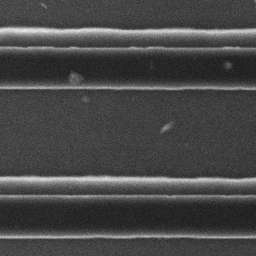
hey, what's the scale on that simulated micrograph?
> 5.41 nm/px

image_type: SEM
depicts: lines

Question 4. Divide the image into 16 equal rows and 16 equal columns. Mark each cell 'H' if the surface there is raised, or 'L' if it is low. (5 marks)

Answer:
LLLLLLLLLLLLLLLL
LLLLLLLLLLLLLLLL
HHHHHHHHHHHHHHHH
HHHHHHHHHHHHHHHH
HHHHHHHHHHHHHHHH
HLLHHHHHHHHHHHHH
LLLLLLLLLLLLLLLL
LLLLLLLLLLLLLLLL
LLLLLLLLLLLLLLLL
LLLLLLLLLLLLLLLL
LLLLLLLLLLLLLLLL
HHHHHHHHHHHHHHHH
HHHHHHHHHHHHHHHH
HHHHHHHHHHHHHHHH
HHHHHHHHHHHHHHHH
LLLLLLLLLLLLLLLL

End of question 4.